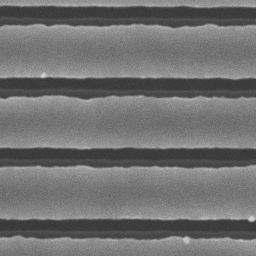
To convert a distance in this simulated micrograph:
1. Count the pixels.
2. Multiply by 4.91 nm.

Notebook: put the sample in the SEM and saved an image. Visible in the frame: lines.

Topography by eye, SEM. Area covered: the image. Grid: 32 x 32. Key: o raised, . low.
oooooooooooooooooooooooooooooooo
................................
................................
ooooooooooooooooooooo.oooooooooo
oooooooooooooooooooooooooooooooo
oooooooooooooooooooooooooooooooo
oooooooooooooooooooooooooooooooo
oooooooooooooooooooooooooooooooo
oooooooooooooooooooooooooooooooo
oooooooooooooooooooooooooooooooo
................................
................................
oooooooooo.ooooooooooooooooooooo
oooooooooooooooooooooooooooooooo
oooooooooooooooooooooooooooooooo
oooooooooooooooooooooooooooooooo
oooooooooooooooooooooooooooooooo
oooooooooooooooooooooooooooooooo
.........ooo..o.....o.........oo
................................
................................
oooooooooooooooooooooooooooooooo
oooooooooooooooooooooooooooooooo
oooooooooooooooooooooooooooooooo
oooooooooooooooooooooooooooooooo
oooooooooooooooooooooooooooooooo
oooooooooooooooooooooooooooooooo
...............................o
................................
................................
oooooooooooooooooooooooooooooooo
oooooooooooooooooooooooooooooooo